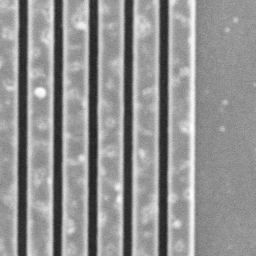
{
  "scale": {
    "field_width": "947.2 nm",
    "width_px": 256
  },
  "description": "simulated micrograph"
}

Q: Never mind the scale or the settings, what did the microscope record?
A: parallel lines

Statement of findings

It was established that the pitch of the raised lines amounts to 130 nm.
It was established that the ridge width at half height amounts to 93.4 nm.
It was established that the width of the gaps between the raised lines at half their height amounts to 0.0347 um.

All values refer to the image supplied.